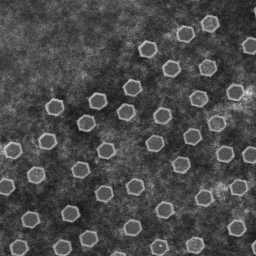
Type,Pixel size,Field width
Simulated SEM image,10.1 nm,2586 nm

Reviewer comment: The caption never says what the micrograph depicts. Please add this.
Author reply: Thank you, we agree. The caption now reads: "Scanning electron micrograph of a regular array of raised bodies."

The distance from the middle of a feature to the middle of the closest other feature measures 319 nm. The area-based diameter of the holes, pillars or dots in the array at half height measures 16.6 px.